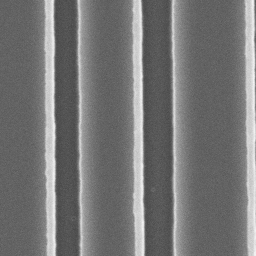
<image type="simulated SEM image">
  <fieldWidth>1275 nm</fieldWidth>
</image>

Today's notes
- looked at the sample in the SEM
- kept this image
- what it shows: lines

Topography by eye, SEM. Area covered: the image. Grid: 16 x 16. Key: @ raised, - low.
@@@--@@@@--@@@@@
@@@--@@@@--@@@@@
@@@--@@@@--@@@@@
@@@--@@@@--@@@@@
@@@--@@@@--@@@@@
@@@--@@@@--@@@@@
@@@--@@@@--@@@@@
@@@--@@@@--@@@@@
@@@--@@@@--@@@@@
@@@--@@@@--@@@@@
@@@--@@@@--@@@@@
@@@--@@@@--@@@@@
@@@--@@@@--@@@@@
@@@--@@@@--@@@@@
@@@--@@@@--@@@@@
@@@--@@@@--@@@@@